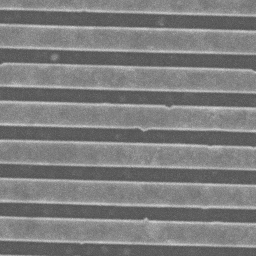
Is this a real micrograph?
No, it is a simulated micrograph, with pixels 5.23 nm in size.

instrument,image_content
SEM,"parallel lines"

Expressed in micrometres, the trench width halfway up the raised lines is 0.0804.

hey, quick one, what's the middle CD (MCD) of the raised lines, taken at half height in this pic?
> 121 nm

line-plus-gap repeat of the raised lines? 201 nm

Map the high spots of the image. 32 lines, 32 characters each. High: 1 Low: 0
11111111111111111111111111111111
00000000000000011111111111111111
00000000000000000000000000000000
11111111110111000000000000000000
11111111111111111111111111111111
11111111111111111111111111111111
00000000000000000000001111111111
00000000000000000000000000000000
11111111111111111111100000000000
11111111111111111111111111111111
11111111111111111111111111111111
00000000000000000000000000000111
00000000000000000000000000000000
11111111111111111111111111110000
11111111111111111111111111111111
11111111111111111111111111111111
00000000000000000000000000000000
00000000000000000000000000000000
11111111111111111111111111111110
11111111111111111111111111111111
00000011111111111111111111111111
00000000000000000000000000000000
11111000000000000000000000000000
11111111111111111111111111111111
11111111111111111111111111111111
00000000000001111111111111111111
00000000000000000000000000000000
11111111111100000010000000000000
11111111111111111111111111111111
11111111111111111111111111111111
00000000000000000000111111111111
00000000000000000000000000000000